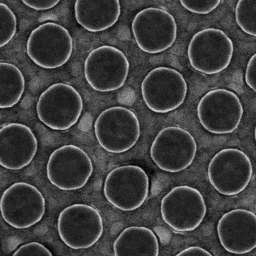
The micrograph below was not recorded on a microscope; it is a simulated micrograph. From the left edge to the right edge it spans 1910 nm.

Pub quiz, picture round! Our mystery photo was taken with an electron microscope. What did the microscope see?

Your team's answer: a regular array of raised bodies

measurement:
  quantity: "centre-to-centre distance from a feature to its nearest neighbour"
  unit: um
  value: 0.446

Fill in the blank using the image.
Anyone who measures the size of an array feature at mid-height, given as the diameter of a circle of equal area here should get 44.2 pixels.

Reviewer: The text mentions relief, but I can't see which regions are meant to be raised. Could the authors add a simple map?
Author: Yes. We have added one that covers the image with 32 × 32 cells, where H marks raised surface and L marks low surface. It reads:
LLLHHHHLLLHHHHHLLLLLLLLHHHHLLLHH
HLLLLLLLLHHHHHHLLLHHHLLLHHLLLLHH
HHLLLLLLLLHHHHHLLHHHHHLLLLLLLLHH
HHLLLHHHLLLHHLLLLHHHHHLLLLLLLLHH
HHLLHHHHHLLLLLLLLHHHHHLLHHHHLLLL
HLLLHHHHHLLLLLLLLHHHHLLLHHHHHLLL
LLLHHHHHHLLLHHHLLLHHLLLLHHHHHLLL
LLLLHHHHLLLHHHHHLLLLLLLLHHHHHLLH
HHLLLLLLLLLHHHHHLLLLHLLLHHHHLLLH
HHHLLLLLLLLHHHHHLLHHHHHLLLLLLLLH
HHHLLLLHLLLHHHHLLLHHHHHLLLLLLLLH
HHHLLLHHHHLLLLLLLLHHHHHLLLHHHLLL
HHLLLHHHHHLLLLLLLLHHHHHLLHHHHHLL
LLLLLHHHHHLLLLHLLLLHHHLLLHHHHHLL
LLLLLHHHHHLLHHHHHLLLLLLLLHHHHHLL
LLLLLLHHHLLLHHHHHLLLLLLLLHHHHHLL
HHHHLLLLLLLLHHHHHLLLHHHLLLLHHLLL
HHHHLLLLLLLLHHHHHLLHHHHHLLLLLLLL
HHHHHLLLHHLLLHHHLLLHHHHHLLLLLLLL
HHHHLLHHHHHLLLLLLLLHHHHHLLLHHHHL
HHHLLLHHHHHLLLLLLLLLHHHHLLHHHHHL
LLLLLLHHHHHLLLHHHHLLLLLLLLHHHHHL
LLLLLLHHHHHLLHHHHHLLLLLLLLHHHHHL
LHHHLLLLHHLLLHHHHHLLLLHHLLLHHHLL
HHHHHLLLLLLLLHHHHHLLLHHHHLLLLLLL
HHHHHHLLLLLLLLHHHHLLHHHHHHLLLLLL
HHHHHLLLHHHHLLLLLLLLHHHHHHLLLHHL
LHHHHLLHHHHHHLLLLLLLLHHHHLLLHHHH
LLLLLLLHHHHHHLLLHHLLLLHHLLLHHHHH
LLLLLLLLHHHHLLLHHHHLLLLLLLLHHHHH
LLLHHLLLHHHHLLHHHHHHLLLLLLLLHHHH
LLHHHHLLLLLLLLHHHHHHLLLHHHLLLHHL